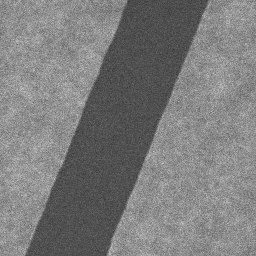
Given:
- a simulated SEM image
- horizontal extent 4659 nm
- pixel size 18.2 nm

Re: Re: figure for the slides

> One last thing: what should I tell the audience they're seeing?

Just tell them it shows one or a few lines or trenches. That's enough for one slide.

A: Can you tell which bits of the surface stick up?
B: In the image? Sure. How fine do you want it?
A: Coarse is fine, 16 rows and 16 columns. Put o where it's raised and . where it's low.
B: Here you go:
oooooooo.....ooo
ooooooo......ooo
ooooooo.....oooo
ooooooo.....oooo
oooooo.....ooooo
oooooo.....ooooo
ooooo......ooooo
ooooo.....oooooo
ooooo.....oooooo
oooo.....ooooooo
oooo.....ooooooo
ooo......ooooooo
ooo.....oooooooo
ooo.....oooooooo
oo.....ooooooooo
oo.....ooooooooo